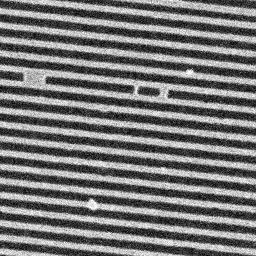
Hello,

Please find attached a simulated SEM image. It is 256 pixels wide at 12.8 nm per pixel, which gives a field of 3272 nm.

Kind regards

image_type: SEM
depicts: parallel lines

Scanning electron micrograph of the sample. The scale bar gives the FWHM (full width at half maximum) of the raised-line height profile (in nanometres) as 60.3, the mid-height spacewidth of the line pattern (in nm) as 122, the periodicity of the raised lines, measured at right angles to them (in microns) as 0.179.